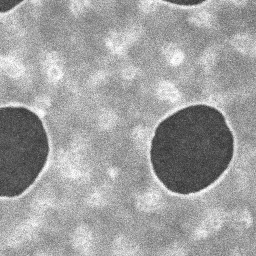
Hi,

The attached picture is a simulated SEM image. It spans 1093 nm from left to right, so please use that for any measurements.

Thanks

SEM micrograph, holes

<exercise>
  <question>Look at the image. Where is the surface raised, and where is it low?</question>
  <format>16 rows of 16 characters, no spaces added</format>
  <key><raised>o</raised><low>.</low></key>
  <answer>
.ooooooooooooooo
oooooooooooooooo
oooooooooooooooo
oooooooooooooooo
oooooooooooooooo
oooooooooooooooo
oooooooooooooooo
...ooooooo....oo
...ooooooo.....o
...oooooo......o
...ooooooo....oo
..oooooooo...ooo
oooooooooooooooo
oooooooooooooooo
oooooooooooooooo
oooooooooooooooo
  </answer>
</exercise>